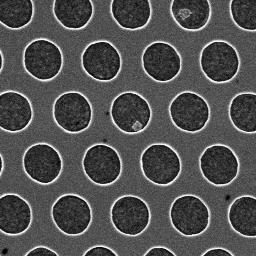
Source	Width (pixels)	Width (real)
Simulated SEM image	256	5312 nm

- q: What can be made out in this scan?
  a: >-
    a regular array of holes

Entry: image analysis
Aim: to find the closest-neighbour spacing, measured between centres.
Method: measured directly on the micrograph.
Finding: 1210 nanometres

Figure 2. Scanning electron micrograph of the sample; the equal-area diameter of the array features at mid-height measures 794 nanometers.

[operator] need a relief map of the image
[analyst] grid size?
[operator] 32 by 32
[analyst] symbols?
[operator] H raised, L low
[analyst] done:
LLLLHHHLLLLHHHLLLLLHHHLLLLHHHLLL
LLLLHHHLLLLHHHLLLLLHHHLLLLHHHLLL
LLLLHHHLLLLHHHHLLLLHHHLLLLHHHLLL
HHHHHHHHHLHHHHHHLHHHHHHLLHHHHHLL
HHHHHHHHHHHHHHHHHHHHHHHHHHHHHHHH
HHHHLLLHHHHHLLHHHHHLLHHHHHLLHHHH
HHHLLLLHHHHLLLLHHHLLLLHHHLLLLHHH
HHHLLLLLHHLLLLLHHHLLLLHHHLLLLLHH
HHHLLLLLHHHLLLLHHHLLLLHHHLLLLLHH
HHHHLLLHHHHLLLHHHHHLLLHHHHLLLHHH
HHHHHHHHHHHHHHHHHHHHHHHHHHHHHHHH
HLHHHHHHHHHHHHHHHHHHHHHHHHHHHHHH
LLLHHHHLLLLHHHLLLLHHHHLLLHHHHLLL
LLLLHHHLLLLHHHLLLLLHHLLLLLHHHLLL
LLLLHHHLLLLHHHLLLLLHHLLLLLHHHLLL
LLLHHHHLLLLHHHLLLLHHHHLLLLHHHLLL
HHHHHHHHHHHHHHHHLHHHHHHHHHHHHHHH
HHHHHHHHHHHHHHHHHHHHHHHHHHHHHHHH
HHHHLLLHHHHLLLHHHHHLLHHHHHLLHHHH
HHHLLLLHHHHLLLLHHHLLLLHHHLLLLHHH
HHHLLLLLHHLLLLLHHHLLLLHHHLLLLLHH
HHHLLLLHHHHLLLLHHHLLLLHHHLLLLLHH
HHHHLLLHHHHHLLHHHHHLLLHHHHLLLHHH
HHHHHHHHHHHHHHHHHHHHHHHHHHHHHHHH
HLHHHHHHLHHHHHHHHHHHHHHLHHHHHHHH
LLLHHHHLLLLHHHLLLLHHHHLLLLHHHLLL
LLLLHHHLLLLHHHLLLLLHHLLLLLHHHLLL
LLLLHHHLLLLHHHLLLLLHHLLLLLHHHLLL
LLLHHHHLLLLHHHHLLLHHHHLLLLHHHLLL
HHHHHHHHHHHHHHHHHHHHHHHHHHHHHHHL
HHHHHHHHHHHHHHHHHHHHHHHHHHHHHHHH
HHHHLLLHHHHLLLHHHHHLLHHHHHLLHHHH